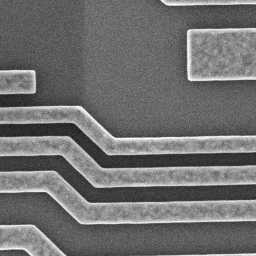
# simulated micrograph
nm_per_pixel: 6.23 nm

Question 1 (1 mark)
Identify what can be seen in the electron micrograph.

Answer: groups of lines, slits or small figures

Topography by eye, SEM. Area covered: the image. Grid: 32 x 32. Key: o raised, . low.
.....................oooooo.....
................................
................................
................................
.......................ooooooooo
.......................ooooooooo
.......................ooooooooo
.......................ooooooooo
.......................ooooooooo
oooo....................oooooooo
oooo............................
oooo............................
................................
.ooooooooo......................
ooooooooooo.....................
.........ooo....................
..........ooo...................
ooooooooo...oooooooooooooooooooo
oooooooooo...ooooooooooooooooooo
........ooo.....................
.........ooo....................
....ooo...oooooooooooooooooooooo
oooooooo...ooooooooooooooooooooo
ooooooooo.......................
......oooo......................
.......ooooooooooooooooooooooooo
.........ooooooooooooooooooooooo
..........oooooooooooooooooooooo
ooooo...........................
oooooo..........................
ooooooo.........................
...ooooo........................